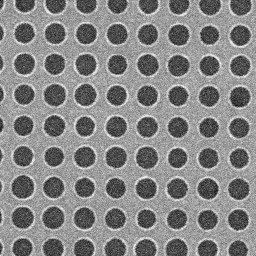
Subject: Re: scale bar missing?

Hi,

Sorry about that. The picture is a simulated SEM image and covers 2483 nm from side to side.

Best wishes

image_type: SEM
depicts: a regular array of holes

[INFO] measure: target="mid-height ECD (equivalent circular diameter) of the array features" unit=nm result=212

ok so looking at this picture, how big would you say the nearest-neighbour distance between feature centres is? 0.296 microns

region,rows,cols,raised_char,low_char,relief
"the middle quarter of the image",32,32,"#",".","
###.....###.....##......##......
###.....###.....##......##.....#
####...#####...####....####...##
################################
################################
####...#####..######..#####...##
.##.....###.....###....###.....#
.##.....###.....##......##.....#
.##.....###.....##......##.....#
###.....###....####....###.....#
####...######.######..#####...##
################################
################################
####...####....####...#####...##
###.....###.....##.....###.....#
###.....##......##......##.....#
###.....##......##.....###.....#
###....####....####....###.....#
####################..######.###
################################
####################.###########
###.....###....###.....####...##
###.....##......##......##.....#
##......##......##......##.....#
###.....##.....###.....###.....#
###....####....####....####...##
################################
################################
####..######..#####...######.###
###....####....###.....###.....#
###.....##......##.....###.....#
###.....##......##.....###.....#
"